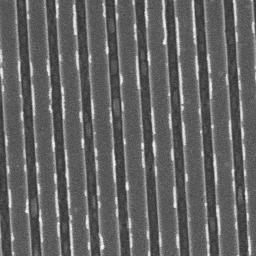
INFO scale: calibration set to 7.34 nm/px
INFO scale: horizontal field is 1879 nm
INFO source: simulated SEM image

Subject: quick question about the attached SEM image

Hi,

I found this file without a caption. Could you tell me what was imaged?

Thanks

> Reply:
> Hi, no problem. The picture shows parallel lines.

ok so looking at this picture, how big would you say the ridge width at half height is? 146 nm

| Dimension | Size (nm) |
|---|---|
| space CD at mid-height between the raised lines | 75.9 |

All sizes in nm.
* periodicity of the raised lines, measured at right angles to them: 217